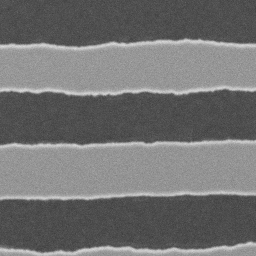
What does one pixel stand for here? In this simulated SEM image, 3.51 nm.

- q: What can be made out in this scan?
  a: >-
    lines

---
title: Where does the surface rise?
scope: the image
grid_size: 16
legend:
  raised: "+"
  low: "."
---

................
................
...........+....
++++++++++++++++
++++++++++++++++
++++++++++++++++
................
................
................
++++++++++++++++
++++++++++++++++
++++++++++++++++
................
................
................
......++.....+++